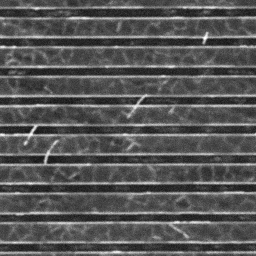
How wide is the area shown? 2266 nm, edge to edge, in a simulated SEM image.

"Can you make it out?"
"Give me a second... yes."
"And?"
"parallel lines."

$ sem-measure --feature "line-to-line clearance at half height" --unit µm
0.0819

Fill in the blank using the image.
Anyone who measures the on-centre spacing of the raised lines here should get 259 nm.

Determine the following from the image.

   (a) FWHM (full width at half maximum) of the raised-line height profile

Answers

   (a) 0.179 microns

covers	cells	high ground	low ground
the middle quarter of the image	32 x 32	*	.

********************************
................................
................................
********************************
********************************
********************************
********************************
********************************
................................
................................
***************...*....*********
********************************
********************************
********************************
********************************
................................
................................
................................
********************************
********************************
********************************
********************************
********************************
................................
................................
********************************
********************************
********************************
********************************
********************************
................................
................................